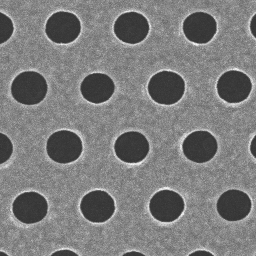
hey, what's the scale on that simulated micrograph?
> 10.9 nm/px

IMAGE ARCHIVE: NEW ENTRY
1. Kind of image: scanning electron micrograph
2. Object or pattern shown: a regular array of holes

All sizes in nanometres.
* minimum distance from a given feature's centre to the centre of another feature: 741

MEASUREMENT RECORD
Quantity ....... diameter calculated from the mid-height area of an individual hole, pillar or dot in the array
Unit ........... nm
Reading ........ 372